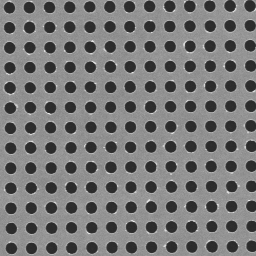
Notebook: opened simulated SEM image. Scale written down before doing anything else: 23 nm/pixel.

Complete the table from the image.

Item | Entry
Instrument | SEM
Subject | a regular array of holes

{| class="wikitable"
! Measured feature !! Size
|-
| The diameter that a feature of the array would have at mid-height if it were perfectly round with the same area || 0.267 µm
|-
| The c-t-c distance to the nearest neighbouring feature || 457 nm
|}